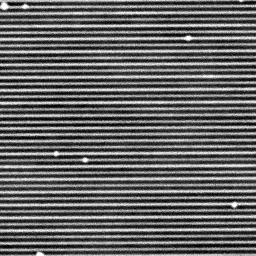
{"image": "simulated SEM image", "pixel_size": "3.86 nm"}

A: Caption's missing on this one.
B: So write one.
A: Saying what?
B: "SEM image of parallel lines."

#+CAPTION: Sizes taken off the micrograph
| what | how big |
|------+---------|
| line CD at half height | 0.0068 microns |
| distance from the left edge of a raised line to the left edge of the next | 24.7 nm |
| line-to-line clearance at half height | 16.4 nanometres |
